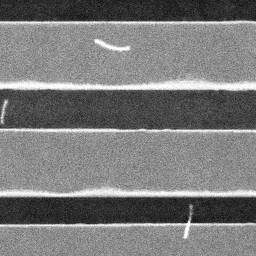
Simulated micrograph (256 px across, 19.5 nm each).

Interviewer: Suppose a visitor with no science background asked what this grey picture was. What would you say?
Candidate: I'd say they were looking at lines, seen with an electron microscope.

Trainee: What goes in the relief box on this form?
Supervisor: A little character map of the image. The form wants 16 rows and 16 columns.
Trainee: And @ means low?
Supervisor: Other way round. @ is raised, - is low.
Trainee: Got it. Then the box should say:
----------------
@@@@@@@@@@@@@@@@
@@@@@@@@@@@@@@@@
@@@@@@@@@@@@@@@@
@@@@@@@@@@@@@@@@
@@@@@@@@@@@@@@@@
----------------
----------------
@@@@@@@@@@@@@@@@
@@@@@@@@@@@@@@@@
@@@@@@@@@@@@@@@@
@@@@@@@@@@@@@@@@
----------------
----------------
@@@@@@@@@@@@@@@@
@@@@@@@@@@@@@@@@